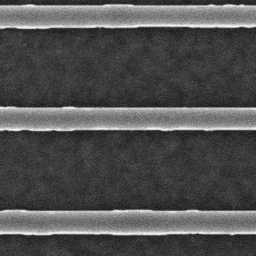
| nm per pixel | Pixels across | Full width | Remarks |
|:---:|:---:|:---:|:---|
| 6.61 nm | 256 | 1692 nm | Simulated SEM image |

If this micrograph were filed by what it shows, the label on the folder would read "lines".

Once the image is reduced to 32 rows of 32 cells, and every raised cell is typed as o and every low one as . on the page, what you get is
................................
oooooooooooooooooooooooooooooooo
oooooooooooooooooooooooooooooooo
..ooo...........................
................................
................................
................................
................................
................................
................................
................................
................................
................................
oo......oo......................
oooooooooooooooooooooooooooooooo
oooooooooooooooooooooooooooooooo
................................
................................
................................
................................
................................
................................
................................
................................
................................
................................
oooooooooooooooooooooooooooooooo
oooooooooooooooooooooooooooooooo
oooooooooooooooooooooooooooooooo
................................
................................
................................